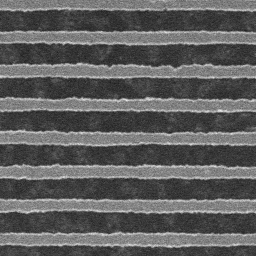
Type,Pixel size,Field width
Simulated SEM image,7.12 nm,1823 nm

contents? parallel lines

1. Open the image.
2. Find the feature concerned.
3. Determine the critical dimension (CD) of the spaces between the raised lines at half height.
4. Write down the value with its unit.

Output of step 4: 163 nanometres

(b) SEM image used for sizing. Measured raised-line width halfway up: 81 nm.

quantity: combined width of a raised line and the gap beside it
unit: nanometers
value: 240